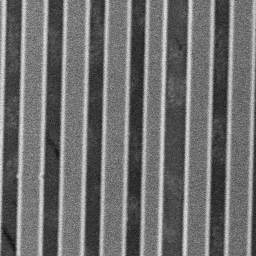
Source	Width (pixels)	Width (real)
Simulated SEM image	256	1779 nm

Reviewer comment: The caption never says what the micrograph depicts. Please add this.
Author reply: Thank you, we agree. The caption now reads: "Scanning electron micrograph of parallel lines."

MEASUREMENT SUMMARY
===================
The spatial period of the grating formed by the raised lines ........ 41.6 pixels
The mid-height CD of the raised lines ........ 165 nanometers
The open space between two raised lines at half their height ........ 17.9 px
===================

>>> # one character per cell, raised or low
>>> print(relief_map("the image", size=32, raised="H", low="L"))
LLLHHHLLHHHLLHHHLLHHHLLLHHHLLHHH
LLLHHHLLHHHLLHHHLLHHHLLLHHHLLHHH
LLLHHHLLHHHLLHHHLLHHHLLLHHHLLHHH
LLLHHHLLHHHLLHHHLLHHHLLLHHHLLHHH
LLLHHHLLHHHLLHHHLLHHHLLLHHLLLHHH
LLLHHHLLHHHLLHHHLLHHHLLLHHLLLHHH
LLLHHHLLHHHLLHHHLLHHHLLLHHLLLHHH
LLLHHHLLHHHLLHHHLLHHLLLLHHLLLHHH
LLLHHHLLHHHLLHHHLLHHLLLLHHLLLHHH
LLLHHHLLHHHLLHHHLLHHLLLLHHLLLHHH
LLLHHHLLHHHLLHHHLLHHLLLHHHLLLHHH
LLLHHHLLHHHLLHHHLLHHLLLLHHLLLHHH
LLLHHHLLHHHLLHHHLLHHLLLLHHLLLHHH
LLLHHHLLHHHLLHHHLLHHLLLLHHLLLHHH
LLLHHLLLHHHLLHHHLLHHLLLLHHLLLHHH
LLLHHLLLHHHLLHHHLLHHLLLHHHLLLHHH
LLLHHLLLHHHLLHHHLLHHLLLHHHLLLHHH
LLLHHLLLHHHLLHHHLLHHLLLHHHLLLHHL
LLLHHLLLHHHLLHHHLLHHLLLHHHLLHHHL
LLLHHLLLHHHLLHHHLLHHLLLHHHLLHHHL
LLHHHLLLHHHLLHHHLLHHLLLHHHLLHHHL
LLHHHLLLHHHLLHHHLLHHLLLHHHLLHHHL
LLHHHLLLHHLLLHHHLLHHLLLHHHLLHHHL
LLHHHLLLHHLLLHHHLLHHLLLHHHLLHHHL
LLHHHLLLHHLLLHHHLLHHLLLHHHLLHHHL
LLHHHLLLHHLLLHHHLLHHLLLHHHLLHHHL
LLHHHLLLHHLLLHHHLLHHLLLHHHLLHHHL
LLHHHLLLHHLLLHHHLLHHLLLHHHLLHHHL
LLHHHLLHHHLLLHHHLLHHLLLHHHLLHHHL
LLHHHLLHHHLLLHHHLLHHLLLHHHLLHHHL
LLHHHLLHHHLLLHHLLLHHLLLHHHLLHHHL
LLHHHLLHHHLLLHHLLLHHLLLHHHLLHHHL